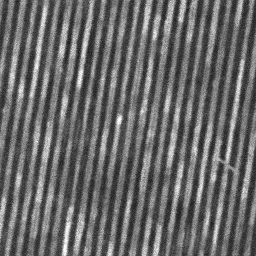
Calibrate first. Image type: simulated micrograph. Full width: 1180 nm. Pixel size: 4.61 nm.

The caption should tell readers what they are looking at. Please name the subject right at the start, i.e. parallel lines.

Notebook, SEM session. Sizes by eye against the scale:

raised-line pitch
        51.9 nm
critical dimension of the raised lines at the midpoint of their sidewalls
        0.0182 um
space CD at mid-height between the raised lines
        31.8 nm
